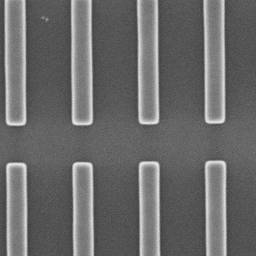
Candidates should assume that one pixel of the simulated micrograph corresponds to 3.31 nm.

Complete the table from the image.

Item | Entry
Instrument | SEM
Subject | groups of lines, slits or small figures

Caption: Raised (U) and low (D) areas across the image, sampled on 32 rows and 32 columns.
DUUDDDDDDUUDDDDDDUUUDDDDDDUUDDDD
DUUDDDDDDUUDDDDDDUUUDDDDDDUUDDDD
DUUDDDDDDUUDDDDDDUUUDDDDDDUUDDDD
DUUDDDDDDUUDDDDDDUUUDDDDDDUUDDDD
DUUDDDDDDUUDDDDDDUUUDDDDDDUUDDDD
DUUDDDDDDUUDDDDDDUUUDDDDDDUUDDDD
DUUDDDDDDUUDDDDDDUUUDDDDDDUUDDDD
DUUDDDDDDUUDDDDDDUUUDDDDDDUUDDDD
DUUDDDDDDUUDDDDDDUUUDDDDDDUUDDDD
DUUDDDDDDUUDDDDDDUUUDDDDDDUUDDDD
DUUDDDDDDUUDDDDDDUUUDDDDDDUUDDDD
DUUDDDDDDUUDDDDDDUUUDDDDDDUUDDDD
DUUDDDDDDUUDDDDDDUUUDDDDDDUUDDDD
DUUDDDDDDUUDDDDDDUUUDDDDDDUUDDDD
DUUDDDDDDUUDDDDDDUUUDDDDDDUUDDDD
DUUDDDDDDDUDDDDDDDDDDDDDDDDDDDDD
DDDDDDDDDDDDDDDDDDDDDDDDDDDDDDDD
DDDDDDDDDDDDDDDDDDDDDDDDDDDDDDDD
DDDDDDDDDDDDDDDDDDDDDDDDDDDDDDDD
DDDDDDDDDDDDDDDDDDDDDDDDDDDDDDDD
DUUDDDDDDUUDDDDDDDUUDDDDDDUUDDDD
DUUDDDDDDUUDDDDDDUUUDDDDDDUUDDDD
DUUDDDDDDUUDDDDDDUUUDDDDDDUUDDDD
DUUDDDDDDUUDDDDDDUUUDDDDDDUUDDDD
DUUDDDDDDUUDDDDDDUUUDDDDDDUUDDDD
DUUDDDDDDUUDDDDDDUUUDDDDDDUUDDDD
DUUDDDDDDUUUDDDDDDUUDDDDDDUUDDDD
DUUDDDDDDUUUDDDDDDUUDDDDDDUUDDDD
DUUDDDDDDUUUDDDDDDUUDDDDDDUUDDDD
DUUDDDDDDUUUDDDDDDUUDDDDDDUUDDDD
DUUDDDDDDUUUDDDDDDUUDDDDDDUUDDDD
DUUDDDDDDUUUDDDDDDUUDDDDDDUUDDDD